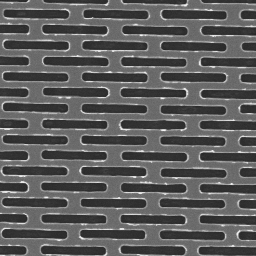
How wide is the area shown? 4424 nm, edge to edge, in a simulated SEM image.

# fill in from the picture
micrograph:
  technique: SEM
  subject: a regular array of holes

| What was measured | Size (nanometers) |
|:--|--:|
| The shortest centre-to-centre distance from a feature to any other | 537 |